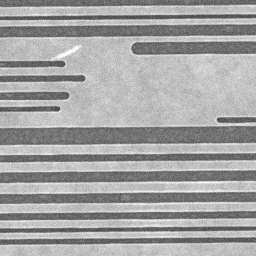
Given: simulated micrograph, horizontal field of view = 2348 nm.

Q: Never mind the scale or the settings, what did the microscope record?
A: groups of lines, slits or small figures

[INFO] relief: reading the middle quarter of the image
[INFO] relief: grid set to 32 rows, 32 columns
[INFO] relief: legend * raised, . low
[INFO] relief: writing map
********************************
********************************
********************************
.....***************************
.....***************************
********************************
********************************
.*******************************
.*******************************
********************************
********************************
********************************
********************************
********************************
********************************
*********..*****................
................................
................................
................................
................................
********************************
********************************
................................
................................
................................
********************************
************************........
................................
................................
................................
********************************
********************************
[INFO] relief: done